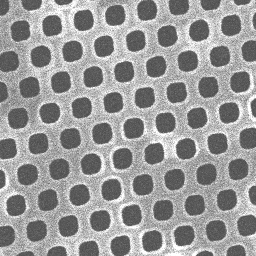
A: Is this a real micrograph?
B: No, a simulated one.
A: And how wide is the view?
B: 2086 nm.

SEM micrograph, a regular array of holes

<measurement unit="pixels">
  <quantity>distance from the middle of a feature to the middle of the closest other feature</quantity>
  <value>32.1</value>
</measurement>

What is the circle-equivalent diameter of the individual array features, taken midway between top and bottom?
175 nm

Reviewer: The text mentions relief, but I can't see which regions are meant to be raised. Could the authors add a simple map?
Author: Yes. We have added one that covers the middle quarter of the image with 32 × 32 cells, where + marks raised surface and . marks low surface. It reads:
+++++++++++++....+++......+++...
+++++....++++....++++....++++...
.++++.....+++.....+++....+++++++
..+++.....+++....+++++++++++++++
..+++.....++++..++++++++++++++++
..+++....+++++++++++++++++....++
.+++++++++++++++++....++++.....+
+++++++++++...++++.....+++.....+
+++...++++.....+++.....+++....++
++.....+++.....+++.....++++..+++
++.....+++.....+++....++++++++++
++.....+++....++++++++++++++++++
++.....+++++++++++++++++...++++.
+++..++++++++++++..++++.....+++.
+++++++++++++++.....+++.....+++.
++++++++....+++.....+++.....+++.
...++++.....+++.....+++....+++++
....+++.....+++.....++++++++++++
....+++.....++++...+++++++++++.+
....++++...+++++++++++++++++....
....+++++++++++++++++....+++....
+++++++++++++....+++.....+++....
++++++..++++.....+++.....+++....
+++++....+++.....+++.....++++...
.+++.....+++.....++++...++++++++
.+++.....++++....+++++++++++++++
.+++.....++++++++++++++++++..+++
.++++...++++++++++++.++++.....++
++++++++++++++++++....+++.....++
++++++++++....+++.....+++.....++
+++...+++.....+++.....+++.....++
+.....+++.....+++.....++++...+++